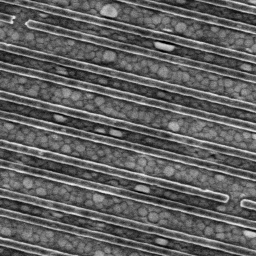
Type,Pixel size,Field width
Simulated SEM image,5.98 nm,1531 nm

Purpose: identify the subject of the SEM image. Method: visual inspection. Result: parallel lines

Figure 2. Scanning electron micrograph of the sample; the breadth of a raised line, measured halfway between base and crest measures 7.53 px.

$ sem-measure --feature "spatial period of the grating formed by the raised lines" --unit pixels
23.6